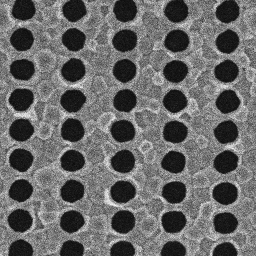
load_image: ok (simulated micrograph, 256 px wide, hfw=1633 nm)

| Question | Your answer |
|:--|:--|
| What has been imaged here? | a regular array of holes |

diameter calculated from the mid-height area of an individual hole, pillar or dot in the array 23.6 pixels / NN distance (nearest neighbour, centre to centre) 0.191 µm